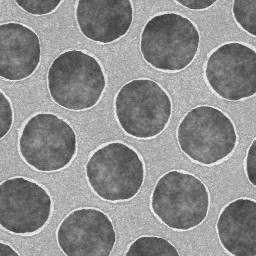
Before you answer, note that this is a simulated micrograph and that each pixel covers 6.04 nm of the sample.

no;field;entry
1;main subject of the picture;holes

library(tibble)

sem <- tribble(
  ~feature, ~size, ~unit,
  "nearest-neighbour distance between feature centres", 418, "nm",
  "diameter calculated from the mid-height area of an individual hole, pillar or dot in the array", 350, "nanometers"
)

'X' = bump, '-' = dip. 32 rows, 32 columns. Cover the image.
XX-----XXX------XXXXXXX----XX---
XXXX--XXXX-------XXXXXXXXXXXX---
XXXXXXXXXX------XXX-----XXXXXX--
----XXXXXX------XX-------XXXXX--
-----XXXXXX----XXX-------XXXXXXX
-----XXXXXXXXXXXXX-------XXX--XX
-----XXX--XXXXXXXX-------XX-----
-----XX-----XXXXXX------XX------
-----X-------XXXXXXX---XXX------
----XX-------XXXXXXXXXXXXX------
XXXXXX-------XXX----XXXXXX------
XXXXXX-------XX------XXXXXX-----
-XXXXXX-----XX-------XXXXXXXX-XX
-XXXXXXX---XXX-------XXX---XXXXX
--XX---XXXXXXXX------XX-----XXXX
-XX-----XXXXXXX------XX------XXX
-XX------XXXXXXX----XX-------XXX
XX-------XXXXXXXXXXXXX--------XX
XX-------XXX----XXXXXXX------XX-
XXX------XX------XXXXXX-----XXX-
XXX-----XXX-------XXXXXXXXXXXXX-
XXXXXXXXXXX-------XXX--XXXXXXXX-
X---XXXXXXX-------XX-----XXXXXX-
-----XXXXXX------XX-------XXXXXX
------XXXXXX-----XX-------XXXXXX
------XXXXXXXXXXXXX-------XXX---
------XXX----XXXXXX-------XX----
------XX------XXXXXX-----XX-----
X----XX-------XXXXXXX---XXX-----
XXXXXXX-------XXXXXXXXXXXXX-----
-XXXXXX-------XXX----XXXXXXX----
--XXXXXX------XX------XXXXXXX---